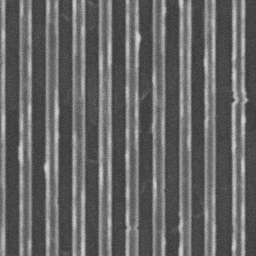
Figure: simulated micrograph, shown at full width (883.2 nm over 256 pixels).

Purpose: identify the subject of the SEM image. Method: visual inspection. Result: parallel lines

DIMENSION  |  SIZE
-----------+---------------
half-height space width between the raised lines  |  50.4 nm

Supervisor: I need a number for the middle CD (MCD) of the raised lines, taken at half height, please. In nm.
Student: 41.3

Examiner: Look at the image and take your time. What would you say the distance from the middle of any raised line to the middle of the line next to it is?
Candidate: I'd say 26.6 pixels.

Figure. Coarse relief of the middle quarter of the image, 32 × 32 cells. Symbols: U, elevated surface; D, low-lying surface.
DDUUUDDDDUUUDDDDUUUDDDUUUDDDDUUU
DDUUUDDDDUUUDDDDUUDDDDUUUDDDDUUU
DDUUUDDDDUUUDDDDUUDDDDUUUDDDDUUU
DDUUUDDDDUUUDDDDUUDDDDUUUDDDDUUU
DDUUUDDDDUUUDDDDUUDDDDUUUDDDDUUU
DDUUUDDDDUUUDDDDUUDDDDUUUDDDDUUU
DDUUUDDDDUUUDDDDUUDDDDUUUDDDDUUU
DDUUUDDDDUUUDDDDUUDDDDUUUDDDDUUU
DDUUUDDDDUUUDDDDUUDDDDUUUDDDDUUU
DDUUUDDDDUUUDDDDUUDDDDUUUDDDDUUU
DDUUUDDDDUUUDDDDUUDDDDUUUDDDDUUU
DDUUUDDDDUUUDDDDUUDDDDUUUDDDDUUU
DDUUUDDDDUUUDDDDUUDDDDUUUDDDDUUU
DDUUUDDDDUUUDDDDUUDDDDUUUDDDDUUU
DDUUUDDDDUUUDDDDUUDDDDUUUDDDDUUU
DDUUUDDDDUUUDDDDUUDDDDUUUDDDDUUU
DDUUUDDDDUUUDDDDUUDDDDUUUDDDDUUU
DDUUUDDDDUUUDDDDUUDDDDUUUDDDDUUU
DDUUUDDDDUUUDDDDUUDDDDUUUDDDDUUU
DDUUUDDDDUUUDDDDUUDDDDUUUDDDDUUU
DDUUUDDDDUUUDDDDUUUDDDUUUDDDDUUU
DDUUUDDDDUUUDDDDUUUDDDUUUDDDDUUU
DDUUUDDDDUUUDDDUUUDDDDUUUDDDDUUU
DDUUUDDDDUUUDDDUUUDDDDUUUDDDDUUU
DDUUUDDDDUUUDDDDUUDDDDUUUDDDDUUU
DDUUUDDDDUUUDDDDUUDDDDUUUDDDDUUU
DDUUUDDDDUUUDDDDUUDDDDUUUDDDDUUU
DDUUUDDDDUUUDDDDUUDDDDUUUDDDDUUU
DDUUUDDDDUUUDDDDUUDDDDUUUDDDDUUU
DDUUUDDDDUUUDDDDUUDDDDUUUDDDDUUU
DDUUUDDDDUUUDDDDUUDDDDUUUDDDDUUU
DDUUUDDDDUUUDDDDUUDDDDUUUDDDDUUU